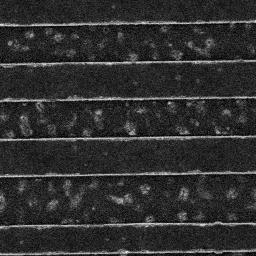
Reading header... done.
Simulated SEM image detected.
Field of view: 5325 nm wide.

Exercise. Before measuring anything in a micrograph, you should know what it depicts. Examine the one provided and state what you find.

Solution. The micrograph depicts one or a few lines or trenches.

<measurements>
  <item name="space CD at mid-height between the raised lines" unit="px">39.5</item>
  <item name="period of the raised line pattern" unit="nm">1640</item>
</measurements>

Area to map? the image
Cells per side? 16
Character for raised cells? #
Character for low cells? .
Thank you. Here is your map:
################
#######.........
................
................
################
################
................
................
................
################
################
................
................
................
################
################